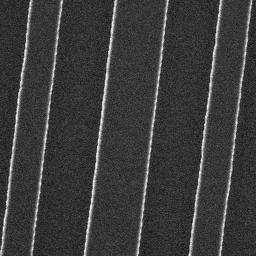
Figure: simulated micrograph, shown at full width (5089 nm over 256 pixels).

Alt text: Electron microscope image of lines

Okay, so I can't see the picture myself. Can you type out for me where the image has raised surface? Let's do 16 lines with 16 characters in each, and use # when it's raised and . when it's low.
..##...###....##
..##...###....##
..##...###...##.
..##...###...##.
.##....###...##.
.##....###...##.
.##...####...##.
.##...####...##.
.##...####...##.
.##...###....##.
.##...###....#..
.##...###...##..
##....###...##..
##....###...##..
##...####...##..
##...####...##..